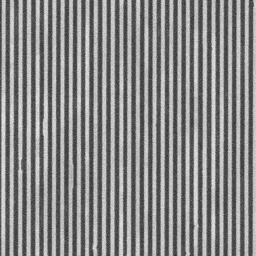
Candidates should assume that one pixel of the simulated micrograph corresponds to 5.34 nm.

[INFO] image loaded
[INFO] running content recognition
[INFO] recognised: parallel lines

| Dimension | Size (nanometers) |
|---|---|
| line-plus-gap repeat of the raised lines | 44.8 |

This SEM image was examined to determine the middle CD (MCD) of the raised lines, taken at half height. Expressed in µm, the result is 0.0194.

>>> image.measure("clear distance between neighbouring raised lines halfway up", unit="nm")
24.7